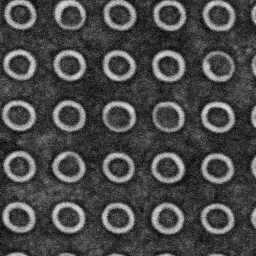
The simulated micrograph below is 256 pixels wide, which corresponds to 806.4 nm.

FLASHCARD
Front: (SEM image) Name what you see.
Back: a regular array of raised bodies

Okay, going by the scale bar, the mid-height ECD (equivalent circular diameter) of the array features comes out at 93.3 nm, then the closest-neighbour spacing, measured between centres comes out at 49.3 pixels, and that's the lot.